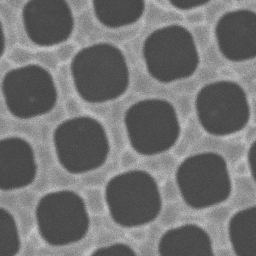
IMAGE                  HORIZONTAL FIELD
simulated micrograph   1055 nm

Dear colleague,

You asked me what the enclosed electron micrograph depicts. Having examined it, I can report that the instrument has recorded a regular array of holes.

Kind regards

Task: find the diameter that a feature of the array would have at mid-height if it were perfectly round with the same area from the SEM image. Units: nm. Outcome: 235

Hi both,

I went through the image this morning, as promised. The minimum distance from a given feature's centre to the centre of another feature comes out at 73.2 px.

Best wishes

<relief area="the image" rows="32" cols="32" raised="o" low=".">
ooo......ooo......ooo.....oooooo
ooo......ooo......ooooooooooo...
ooo......ooo.....oooooooooo.....
ooo......ooooo.ooooo...oooo.....
.oo......oooooooooo.....ooo.....
.ooo...ooooo..oooo......ooo.....
oooooooooo.....ooo.......ooo....
ooooooooo.......oo.......oooo..o
oo...oooo.......oo.......ooooooo
o.....ooo.......ooo.....oooooooo
.......oo.......oooooooooo....oo
.......ooo......ooooooooo......o
o......ooo....oooo...ooo.......o
o......ooooooooo......oo.......o
oo...ooooooooooo......ooo......o
oooooooo.....ooo......ooo......o
ooooooo......ooo.......ooo....oo
...oooo.......oo......oooooooooo
....ooo.......ooo....oooooooooo.
....ooo......ooooooooooo....ooo.
.....ooo.....oooooooooo.....ooo.
.....oooo..ooooo..oooo.......oo.
....oooooooooo.....ooo.......ooo
...oooooooooo.......oo.......ooo
ooooo.....ooo.......ooo......ooo
ooooo......oo.......ooo....ooooo
.ooo.......ooo......oooooooooo..
..ooo......ooo.....oooooooooo...
..ooo......ooooooooooo...oooo...
..ooo......ooooooooo......ooo...
...ooo...ooooo..oooo......ooo...
..oooooooooo.....ooo.......oo...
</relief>